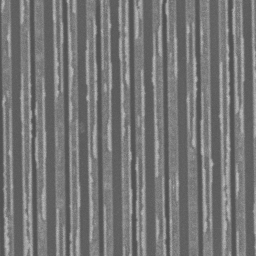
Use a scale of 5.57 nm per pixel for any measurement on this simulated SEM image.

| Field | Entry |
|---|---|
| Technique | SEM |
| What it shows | parallel lines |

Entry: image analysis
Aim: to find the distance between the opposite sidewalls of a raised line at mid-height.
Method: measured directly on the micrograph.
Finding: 8.87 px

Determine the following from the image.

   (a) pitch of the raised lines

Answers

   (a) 0.0922 µm